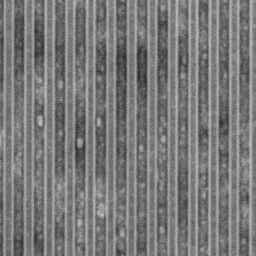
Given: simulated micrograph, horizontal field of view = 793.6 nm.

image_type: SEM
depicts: parallel lines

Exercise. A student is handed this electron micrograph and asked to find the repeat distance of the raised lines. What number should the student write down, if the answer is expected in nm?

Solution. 63.5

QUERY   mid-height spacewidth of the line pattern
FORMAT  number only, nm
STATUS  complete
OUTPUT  38.3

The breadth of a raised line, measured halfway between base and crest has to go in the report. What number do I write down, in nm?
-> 26.7